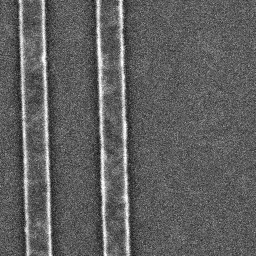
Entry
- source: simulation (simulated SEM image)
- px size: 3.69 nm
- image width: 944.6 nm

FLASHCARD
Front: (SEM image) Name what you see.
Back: one or a few lines or trenches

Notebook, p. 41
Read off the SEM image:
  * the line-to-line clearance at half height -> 200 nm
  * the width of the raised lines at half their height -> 85.3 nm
